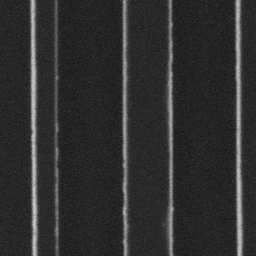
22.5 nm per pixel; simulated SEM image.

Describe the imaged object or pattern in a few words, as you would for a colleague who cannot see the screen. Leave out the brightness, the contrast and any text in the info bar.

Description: lines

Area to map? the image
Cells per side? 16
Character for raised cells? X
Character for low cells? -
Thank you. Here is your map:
--XX----XXX----X
--XX----XXX----X
--XX----XXX----X
--XX----XXX----X
--XX----XXX----X
--XX----XXX----X
--XX----XXX----X
--XX----XXX----X
--XX----XXX----X
--XX----XXX----X
--XX----XXX----X
--XX----XXX----X
--XX----XXX----X
--XX----XXX----X
--XX----XXX----X
--XX----XXX----X